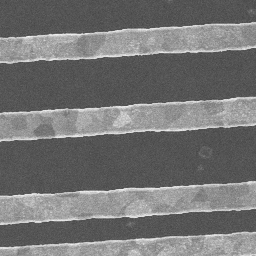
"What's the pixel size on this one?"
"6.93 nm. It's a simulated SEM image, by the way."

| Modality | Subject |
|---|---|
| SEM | lines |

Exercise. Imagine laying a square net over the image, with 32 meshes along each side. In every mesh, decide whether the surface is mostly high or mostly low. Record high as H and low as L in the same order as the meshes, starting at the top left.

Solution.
LLLLLLLLLLLLLLLLLLLLLLLLLLLLLLLL
LLLLLLLLLLLLLLLLLLLLLLLLLLLLLLLL
LLLLLLLLLLLLLLLLLLLLLLLLLLLLLLLL
LLLLLLLLLLLLLLLLLLLLLHHHHHHHHHHH
LLLLLHHHHHHHHHHHHHHHHHHHHHHHHHHH
HHHHHHHHHHHHHHHHHHHHHHHHHHHHHHHH
HHHHHHHHHHHHHHHHHHHHHHHHLLLLLLLL
HHHHHHHLLLLLLLLLLLLLLLLLLLLLLLLL
LLLLLLLLLLLLLLLLLLLLLLLLLLLLLLLL
LLLLLLLLLLLLLLLLLLLLLLLLLLLLLLLL
LLLLLLLLLLLLLLLLLLLLLLLLLLLLLLLL
LLLLLLLLLLLLLLLLLLLLLLLLLLLLLLLL
LLLLLLLLLLLLLLLLLLLLLLLLLLLLHHHH
LLLLLLLLLLLLHHHHHHHHHHHHHHHHHHHH
HHHHHHHHHHHHHHHHHHHHHHHHHHHHHHHH
HHHHHHHHHHHHHHHHHHHHHHHHHHHHHHHH
HHHHHHHHHHHHHHHHHLLLLLLLLLLLLLLL
HHLLLLLLLLLLLLLLLLLLLLLLLLLLLLLL
LLLLLLLLLLLLLLLLLLLLLLLLLLLLLLLL
LLLLLLLLLLLLLLLLLLLLLLLLLLLLLLLL
LLLLLLLLLLLLLLLLLLLLLLLLLLLLLLLL
LLLLLLLLLLLLLLLLLLLLLLLLLLLLLLLL
LLLLLLLLLLLLLLLLLLLLLLLLLLLLLLLL
LLLLLLLLLLLLLLLLLLLLHHHHHHHHHHHH
LHHHHHHHHHHHHHHHHHHHHHHHHHHHHHHH
HHHHHHHHHHHHHHHHHHHHHHHHHHHHHHHH
HHHHHHHHHHHHHHHHHHHHHHHHLLLLLLLL
HHHHHHHHHLLLLLLLLLLLLLLLLLLLLLLL
LLLLLLLLLLLLLLLLLLLLLLLLLLLLLLLL
LLLLLLLLLLLLLLLLLLLLLLLLLLHHHHHH
LLLLLLLLLLHHHHHHHHHHHHHHHHHHHHHH
HHHHHHHHHHHHHHHHHHHHHHHHHHHHHHHH